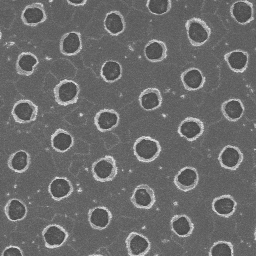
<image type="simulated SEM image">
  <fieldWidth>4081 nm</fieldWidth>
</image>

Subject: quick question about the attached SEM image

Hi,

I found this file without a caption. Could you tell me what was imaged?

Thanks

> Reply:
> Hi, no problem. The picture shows a regular array of holes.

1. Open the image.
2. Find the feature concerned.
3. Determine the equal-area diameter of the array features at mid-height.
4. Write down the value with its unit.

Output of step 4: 314 nanometres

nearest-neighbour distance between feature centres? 751 nm